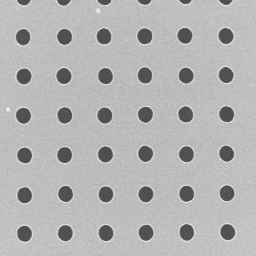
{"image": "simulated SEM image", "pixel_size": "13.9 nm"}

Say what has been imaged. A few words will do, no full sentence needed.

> a regular array of holes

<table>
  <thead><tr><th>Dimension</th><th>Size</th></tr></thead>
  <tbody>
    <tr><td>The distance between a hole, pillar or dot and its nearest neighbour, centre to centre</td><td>542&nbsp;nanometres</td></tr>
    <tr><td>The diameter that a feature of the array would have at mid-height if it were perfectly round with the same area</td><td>212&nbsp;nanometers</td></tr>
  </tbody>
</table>